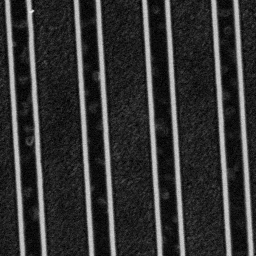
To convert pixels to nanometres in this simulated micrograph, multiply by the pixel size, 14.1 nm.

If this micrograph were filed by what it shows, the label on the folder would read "one or a few lines or trenches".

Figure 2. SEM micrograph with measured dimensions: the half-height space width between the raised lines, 642 nanometres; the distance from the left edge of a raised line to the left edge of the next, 68.8 pixels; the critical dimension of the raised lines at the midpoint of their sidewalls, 316 nm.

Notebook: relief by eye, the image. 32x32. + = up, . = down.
.+++......++......+++......++...
.+++......++......+++......+++..
.+++......++......+++......+++..
.+++......++......+++......+++..
.+++......+++.....+++......+++..
.+++......+++.....+++......+++..
.+++......+++.....+++......+++..
.+++......+++......++......+++..
.+++......+++......++......+++..
.+++......+++......++......+++..
..++......+++......+++.....+++..
..++......+++......+++.....+++..
..++......+++......+++.....+++..
..++......+++......+++......++..
..+++.....+++......+++......++..
..+++.....+++......+++......++..
..+++......++......+++......++..
..+++......++......+++......++..
..+++......++......+++......+++.
..+++......++......+++......+++.
..+++......+++.....+++......+++.
..+++......+++.....+++......+++.
..+++......+++.....+++......+++.
..+++......+++.....+++......+++.
..+++......+++......++......+++.
..+++......+++......++......+++.
..+++......+++......+++.....+++.
...++......+++......+++.....+++.
...++......+++......+++.....+++.
...++......+++......+++.....+++.
...++......+++......+++......++.
...+++.....+++......+++......++.